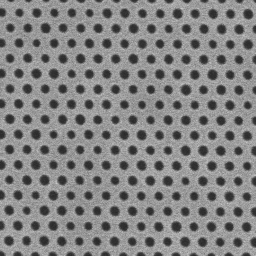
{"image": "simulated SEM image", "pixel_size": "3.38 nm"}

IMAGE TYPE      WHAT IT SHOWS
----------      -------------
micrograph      a regular array of holes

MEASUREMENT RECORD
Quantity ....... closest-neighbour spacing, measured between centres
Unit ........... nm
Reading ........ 58.6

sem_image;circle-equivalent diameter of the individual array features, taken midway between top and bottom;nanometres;30.3